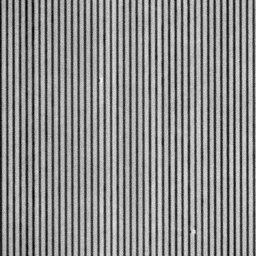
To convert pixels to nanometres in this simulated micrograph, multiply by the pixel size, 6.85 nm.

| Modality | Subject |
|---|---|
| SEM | parallel lines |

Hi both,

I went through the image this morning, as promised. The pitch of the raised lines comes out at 44.5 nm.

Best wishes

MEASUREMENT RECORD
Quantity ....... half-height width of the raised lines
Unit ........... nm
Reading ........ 25.7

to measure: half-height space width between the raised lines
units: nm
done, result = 18.8